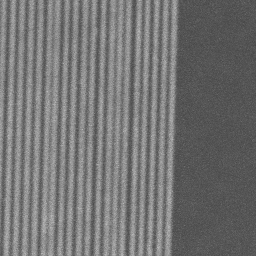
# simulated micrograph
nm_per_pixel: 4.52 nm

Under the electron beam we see parallel lines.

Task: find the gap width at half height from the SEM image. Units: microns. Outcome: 0.0181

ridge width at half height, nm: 22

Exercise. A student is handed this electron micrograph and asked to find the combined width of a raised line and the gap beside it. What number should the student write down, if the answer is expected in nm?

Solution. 40.5